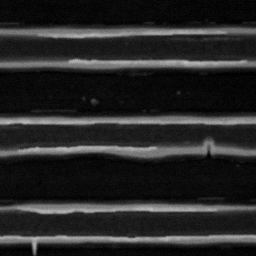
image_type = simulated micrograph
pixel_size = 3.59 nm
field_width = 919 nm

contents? one or a few lines or trenches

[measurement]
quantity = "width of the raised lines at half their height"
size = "0.121 micrometres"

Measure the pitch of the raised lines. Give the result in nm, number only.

315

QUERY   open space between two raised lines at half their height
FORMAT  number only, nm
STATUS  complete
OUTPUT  194